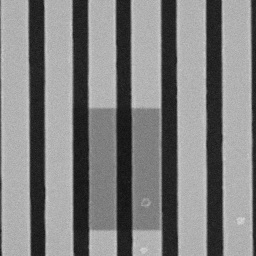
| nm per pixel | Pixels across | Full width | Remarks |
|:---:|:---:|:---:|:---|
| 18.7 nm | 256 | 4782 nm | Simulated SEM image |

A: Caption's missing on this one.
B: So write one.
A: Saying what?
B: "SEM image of lines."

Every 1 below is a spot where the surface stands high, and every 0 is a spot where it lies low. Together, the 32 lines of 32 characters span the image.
11110011100111001111001111001110
11110011100111001111001111001110
11110011100111001111001111001110
11110011100111001111001111001110
11110011100111001111001111001110
11110011100111001111001111001110
11110011100111001111001111001110
11110011100111001111001111001110
11110011100111001111001111001110
11110011100111001111001111001110
11110011100111001111001111001110
11110011100111001111001111001110
11110011100111001111001111001110
11110011100111001111001111001110
11110011100111001111001111001110
11110011100111001111001111001110
11110011100111001111001111001110
11110011100111101111001111001110
11110011100111101111001111001110
11110011100111101111001111001110
11110011100111101111001111001111
11110011100111101111001111001111
11110011100111101111001111001111
11110011100111101111001111001111
11110011100111101111001111001111
11110011100111101111001111001111
11110011100111101111001111001111
11110011100111100111001111001111
11110011100111100111001111001111
11110011100111100111001111001111
11110011100111100111001111001111
11110011100111100111001111001111